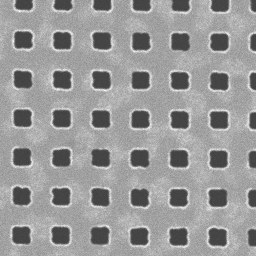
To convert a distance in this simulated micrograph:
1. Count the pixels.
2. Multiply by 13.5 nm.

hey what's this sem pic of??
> a regular array of holes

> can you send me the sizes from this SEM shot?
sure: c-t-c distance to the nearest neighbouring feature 525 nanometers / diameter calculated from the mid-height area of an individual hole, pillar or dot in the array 0.27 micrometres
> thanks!